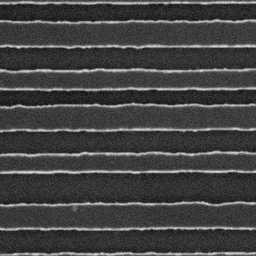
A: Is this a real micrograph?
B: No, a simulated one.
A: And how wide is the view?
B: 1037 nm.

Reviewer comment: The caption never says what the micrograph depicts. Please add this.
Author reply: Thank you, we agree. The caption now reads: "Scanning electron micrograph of lines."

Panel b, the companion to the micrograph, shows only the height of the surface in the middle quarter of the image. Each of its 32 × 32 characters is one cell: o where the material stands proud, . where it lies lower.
................................
........ooo.....oooo............
oooooooooooooooooooooooooooooooo
oooooooooooooooooooooooooooooooo
oooooooooooooooooooooooooooooooo
oooooooooooooooooooooooooooooooo
................................
................................
................................
................................
ooooooooo.o..ooooooooooooo.ooooo
oooooooooooooooooooooooooooooooo
oooooooooooooooooooooooooooooooo
oooooooooooooooooooooooooooooooo
oooooooooooooooooooooooooooooooo
oooooooooooooooooooooooooooooooo
oooooooooooooooooooooooooooooooo
................................
................................
................................
................................
................................
....oooooooooooooo.oooooooo.ooo.
oooooooooooooooooooooooooooooooo
oooooooooooooooooooooooooooooooo
oooooooooooooooooooooooooooooooo
oooooooooooooooooooooooooooooooo
................................
................................
................................
................................
................................